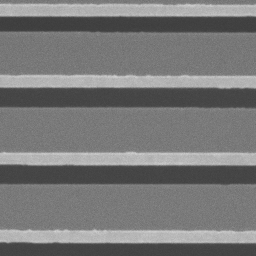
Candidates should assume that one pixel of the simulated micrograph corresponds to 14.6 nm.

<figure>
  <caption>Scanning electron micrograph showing lines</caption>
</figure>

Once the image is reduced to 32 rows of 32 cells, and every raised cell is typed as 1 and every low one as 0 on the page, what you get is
11111111111111111111111111111111
11111111111111111111111111111111
00000000000000000000000000000000
00000000000000000000000000000000
11111111111111111111111111111111
11111111111111111111111111111111
11111111111111111111111111111111
11111111111111111111111111111111
11111111111111111111111111111111
11111111111111111111111111111111
11111111111111111111111111111111
00000000000000000000000000000000
00000000000000000000000000000000
00000000000000000000000000000000
11111111111111111111111111111111
11111111111111111111111111111111
11111111111111111111111111111111
11111111111111111111111111111111
11111111111111111111111111111111
11111111111111111111111111111111
00111111111111111111111111111111
00000000000000000000000000000000
00000000000000000000000000000000
11111111111111111111111111111111
11111111111111111111111111111111
11111111111111111111111111111111
11111111111111111111111111111111
11111111111111111111111111111111
11111111111111111111111111111111
11111111111111111111111111111111
00000000000000000000000000000000
00000000000000000000000000000000